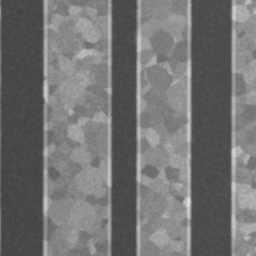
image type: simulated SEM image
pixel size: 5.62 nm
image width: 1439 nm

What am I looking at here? one or a few lines or trenches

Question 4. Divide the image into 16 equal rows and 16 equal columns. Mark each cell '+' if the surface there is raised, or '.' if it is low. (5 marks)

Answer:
...++++..+++...+
...++++..+++...+
...++++..+++...+
...++++..+++...+
...++++..+++...+
...++++..+++...+
...++++..+++...+
...++++..+++...+
...++++..+++...+
...++++..+++...+
...++++..+++...+
...++++..+++...+
...++++..+++...+
...++++..+++...+
...++++..+++...+
...++++..+++...+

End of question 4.